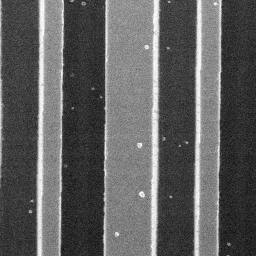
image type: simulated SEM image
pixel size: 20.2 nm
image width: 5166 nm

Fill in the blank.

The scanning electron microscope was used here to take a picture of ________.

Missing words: lines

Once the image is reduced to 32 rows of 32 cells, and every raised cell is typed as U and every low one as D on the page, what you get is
DDDDDUUUDDDDDUUUUUUDDDDDDUUUDDDD
DDDDDUUUDDDDDUUUUUUDDDDDDUUDDDDD
DDDDDUUUDDDDDUUUUUUDDDDDDUUDDDDD
DDDDDUUUDDDDDUUUUUUDDDDDDUUDDDDD
DDDDDUUUDDDDDUUUUUUDDDDDDUUDDDDD
DDDDDUUUDDDDDUUUUUUDDDDDDUUDDDDD
DDDDDUUUDDDDDUUUUUUDDDDDDUUDDDDD
DDDDDUUUDDDDDUUUUUUDDDDDDUUDDDDD
DDDDDUUUDDDDDUUUUUUDDDDDDUUDDDDD
DDDDDUUUDDDDDUUUUUUDDDDDDUUDDDDD
DDDDDUUUDDDDDUUUUUUDDDDDDUUDDDDD
DDDDDUUUDDDDDUUUUUUDDDDDDUUDDDDD
DDDDDUUUDDDDDUUUUUUDDDDDDUUDDDDD
DDDDDUUUDDDDDUUUUUUDDDDDDUUDDDDD
DDDDDUUUDDDDDUUUUUUDDDDDDUUDDDDD
DDDDDUUUDDDDDUUUUUUDDDDDDUUDDDDD
DDDDDUUUDDDDDUUUUUUDDDDDDUUDDDDD
DDDDDUUUDDDDDUUUUUUDDDDDDUUDDDDD
DDDDDUUUDDDDDUUUUUUDDDDDDUUDDDDD
DDDDDUUUDDDDDUUUUUUDDDDDDUUDDDDD
DDDDDUUUDDDDDUUUUUUDDDDDDUUDDDDD
DDDDDUUUDDDDDUUUUUUDDDDDDUUDDDDD
DDDDDUUUDDDDDUUUUUUDDDDDDUUDDDDD
DDDDDUUUDDDDDUUUUUUDDDDDDUUDDDDD
DDDDDUUUDDDDDUUUUUUDDDDDDUUDDDDD
DDDDDUUUDDDDDUUUUUUDDDDDDUUDDDDD
DDDDDUUUDDDDDUUUUUUDDDDDDUUDDDDD
DDDDDUUUDDDDDUUUUUUDDDDDDUUDDDDD
DDDDDUUDDDDDDUUUUUUDDDDDDUUDDDDD
DDDDDUUDDDDDDUUUUUUDDDDDDUUDDDDD
DDDDDUUDDDDDDUUUUUUDDDDDDUUDDDDD
DDDDDUUDDDDDDUUUUUUDDDDDDUUDDDDD